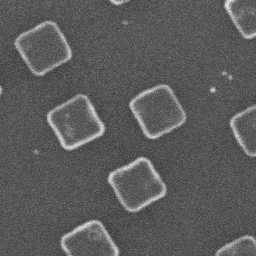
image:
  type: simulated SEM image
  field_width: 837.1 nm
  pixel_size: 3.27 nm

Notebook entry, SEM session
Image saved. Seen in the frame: raised bodies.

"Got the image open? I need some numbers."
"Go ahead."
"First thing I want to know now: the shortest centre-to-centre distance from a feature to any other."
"259 nm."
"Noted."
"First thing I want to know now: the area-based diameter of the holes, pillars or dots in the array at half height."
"49.5 pixels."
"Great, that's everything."